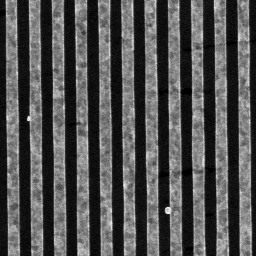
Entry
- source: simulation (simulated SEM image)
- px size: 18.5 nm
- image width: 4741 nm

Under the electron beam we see wiring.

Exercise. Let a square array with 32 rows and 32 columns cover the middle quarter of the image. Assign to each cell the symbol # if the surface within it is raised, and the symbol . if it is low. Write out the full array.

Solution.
...###...##....##....##...###...
...###...##....##....##...###...
...###...##....##....##...###...
...###...##....##....##...###...
...###...##....##....##...###...
...###...##....##....##...###...
...###...##....##....##...###...
...###...##....##....##...###...
...###...##....##....##...###...
...###...###...##....##...###...
...###...###...##....##...###...
...###...###...##....##...###...
...###...###...##....##...###...
...###...###...##....##...###...
...###...###...##....##...###...
...###...###...##....##...###...
...###...###...##....##...###...
...###...###...##....##...###...
...###...###...##....##...###...
...###...###...##....##...###...
...###...###...###...##...###...
...###...###...###...##...###...
...###...###...###...##...###...
...###...###...###...##...###...
...###...###...###...##...###...
...###...###...###...##...###...
...###...###...###...##...###...
...###...###...###...##....##...
...###...###...###...##....##...
...###...###...###...##....##...
...#.#...###...##....##....##...
...###...###...##....##....##...